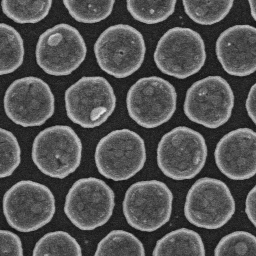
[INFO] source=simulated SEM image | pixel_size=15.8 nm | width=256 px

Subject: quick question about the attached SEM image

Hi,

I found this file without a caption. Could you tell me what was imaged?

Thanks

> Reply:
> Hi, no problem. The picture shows a regular array of raised bodies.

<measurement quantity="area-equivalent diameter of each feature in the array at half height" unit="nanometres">770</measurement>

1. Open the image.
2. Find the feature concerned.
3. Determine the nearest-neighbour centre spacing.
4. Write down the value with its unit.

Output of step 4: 0.909 um